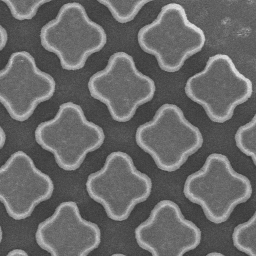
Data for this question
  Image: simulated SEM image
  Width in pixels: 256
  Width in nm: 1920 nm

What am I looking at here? a regular array of raised bodies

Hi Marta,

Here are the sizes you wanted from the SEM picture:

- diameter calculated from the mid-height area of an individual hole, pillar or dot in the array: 418 nanometres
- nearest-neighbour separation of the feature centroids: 521 nanometres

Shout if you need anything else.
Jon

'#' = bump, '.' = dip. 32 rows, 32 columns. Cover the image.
.####........#####..............
..##....##....###...###.........
.......####.........###.........
......######......######........
.....########.....#######.......
......#######.....#######.......
.......####........#####........
.###....##....##....###...###...
.####........####....#....###...
######......######......######..
#######....########....########.
#######.....#######.....#######.
#####........#####......######..
.###....##....###...##....###...
..#....###....##....###...##....
......#####........#####.......#
.....########....########.....##
.....########....########.....##
......######......#######.....##
..#....###....##...####........#
.###....##...###....##....###...
#####.......#####........####...
######.....#######......#######.
######.....########....########.
######......######.....########.
.###....#....####...#....####...
.###...###....##...###....###...
......####.........####....#...#
.....#######.....#######......##
.....#######.....########....###
.....#######......#######.....##
......#####........####........#